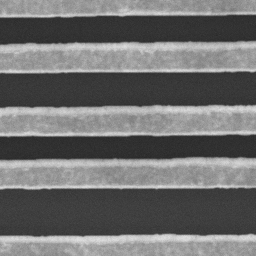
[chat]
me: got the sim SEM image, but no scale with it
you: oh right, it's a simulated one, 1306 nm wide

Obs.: lines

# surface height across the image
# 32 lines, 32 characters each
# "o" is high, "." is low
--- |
oooooooooooooooooooooooooooooooo
oooooooooooooooooooooooooooooooo
................................
................................
................................
.......................oo..ooooo
oooooooooooooooooooooooooooooooo
oooooooooooooooooooooooooooooooo
oooooooooooooooooooooooooooooooo
................................
................................
................................
................................
..............oo...ooooooooooooo
oooooooooooooooooooooooooooooooo
oooooooooooooooooooooooooooooooo
oooooooooooooooooooooooooooooooo
................................
................................
................................
oooooooooooooooooooooooooooooooo
oooooooooooooooooooooooooooooooo
oooooooooooooooooooooooooooooooo
o..oo...........................
................................
................................
................................
................................
................................
................................
oooooooooooooooooooooooooooooooo
oooooooooooooooooooooooooooooooo